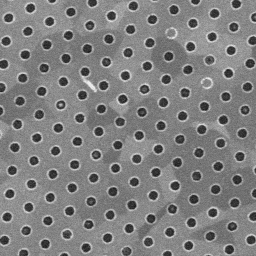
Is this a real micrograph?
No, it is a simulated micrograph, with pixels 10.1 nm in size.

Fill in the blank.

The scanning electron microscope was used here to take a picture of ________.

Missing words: a regular array of holes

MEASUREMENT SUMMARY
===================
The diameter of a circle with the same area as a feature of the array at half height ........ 100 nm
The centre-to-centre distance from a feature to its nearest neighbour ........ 233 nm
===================